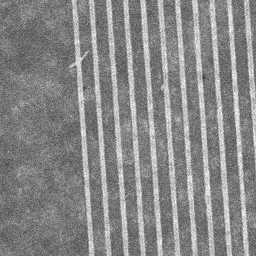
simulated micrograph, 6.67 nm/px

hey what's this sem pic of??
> parallel lines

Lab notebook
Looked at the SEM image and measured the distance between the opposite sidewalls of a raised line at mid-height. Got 3.36 pixels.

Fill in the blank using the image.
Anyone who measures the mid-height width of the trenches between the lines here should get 90.7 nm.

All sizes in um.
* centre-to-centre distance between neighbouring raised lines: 0.115